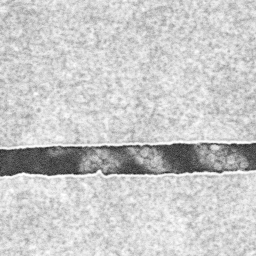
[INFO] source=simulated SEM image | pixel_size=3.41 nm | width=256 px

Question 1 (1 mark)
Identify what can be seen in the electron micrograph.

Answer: one or a few lines or trenches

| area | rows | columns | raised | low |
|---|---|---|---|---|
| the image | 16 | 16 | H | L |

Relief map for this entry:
HHHHHHHHHHHHHHHH
HHHHHHHHHHHHHHHH
HHHHHHHHHHHHHHHH
HHHHHHHHHHHHHHHH
HHHHHHHHHHHHHHHH
HHHHHHHHHHHHHHHH
HHHHHHHHHHHHHHHH
HHHHHHHHHHHHHHHH
HHHHHHHHHHHHHHHH
LLLLLLLLLLLLLLLL
LLLLLLLLLLLLLLLL
HHHHHHHHHHHHHHHH
HHHHHHHHHHHHHHHH
HHHHHHHHHHHHHHHH
HHHHHHHHHHHHHHHH
HHHHHHHHHHHHHHHH